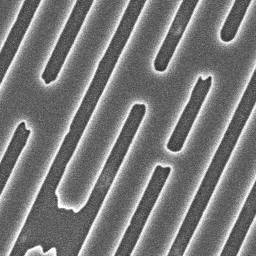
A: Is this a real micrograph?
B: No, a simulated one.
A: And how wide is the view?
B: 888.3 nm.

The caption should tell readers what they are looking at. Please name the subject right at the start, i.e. parallel lines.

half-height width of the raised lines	112	nanometres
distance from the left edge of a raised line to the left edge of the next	165	nanometers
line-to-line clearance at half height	53.3	nm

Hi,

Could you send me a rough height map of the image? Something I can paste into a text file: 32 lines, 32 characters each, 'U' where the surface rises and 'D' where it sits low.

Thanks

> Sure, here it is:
UUUDDUUUUDDDUUUUDDUUUUUDDUUUUDDU
UUDDUUUUUDDUUUUDDDUUUUDDUUUUUDDU
UUDDUUUUDDDUUUUDDUUUUUDDUUUUDDUU
UDDDUUUUDDUUUUUDDUUUUDDUUUUUDDUU
UDDUUUUDDDUUUUDDUUUUUDDUUUUUDUUU
DDDUUUUDDUUUUUDDUUUUDDUUUUUUUUUU
DDUUUUUDDUUUUDDUUUUUDDUUUUUUUUUU
DDUUUUDDUUUUUDDUUUUDDUUUUUUUUUUU
DUUUUUDDUUUUDDUUUUUDDUUUUUUUUUUU
DUUUUDDUUUUUDDUUUUUUUUUUUUUUUUUD
UUUUUUUUUUUDDUUUUUUUUUUUDDUUUUUD
UUUUUUUUUUUDDUUUUUUUUUUUDDUUUUDD
UUUUUUUUUUDDUUUUUUUUUUUUDDUUUUDD
UUUUUUUUUUDDUUUUDDUUUUUDDUUUUUDD
UUUUUUUUUDDUUUUUDDUUUUUDDUUUUDDU
UUDUUUUUUDDUUUUDDDUUUUDDUUUUUDDU
UUDDUUUUDDDUUUUDDUUUUDDDUUUUDDUU
UDDUUUUUDDUUUUUDDUUUUDDUUUUUDDUU
UDDUUUUDDDUUUUDDUUUUUDDUUUUDDUUU
DDUUUUUDDUUUUUDDUUUUUUUUUUUDDUUU
DDUUUUDDDUUUUDDUUUUUUUUUUUDDUUUU
DDUUUUDDUUUUUDDUUUUDDUUUUUDDUUUU
DUUUUUDDUUUUDDUUUUUDDUUUUDDUUUUU
DUUUUDDUUUUUDDUUUUDDUUUUUDDUUUUD
UUUUUDDUUUUDDUUUUUDDUUUUDDUUUUUD
UUUUDDDUUUUDDUUUUDDUUUUUDDUUUUDD
UUUUDDDDDDDDUUUUUDDUUUUDDDUUUUDD
UUUDDDDDDDDDUUUUDDUUUUUDDUUUUDDD
UUUDDDDDDDDUUUUUDDUUUUUDDUUUUDDU
UUDDDDDDDDDUUUUDDDUUUUDDUUUUUDDU
UUDDDDDDDDUUUUUDDUUUUUDDUUUUDDUU
UDDUUUUDDDUUUUDDDUUUUDDUUUUUDDUU